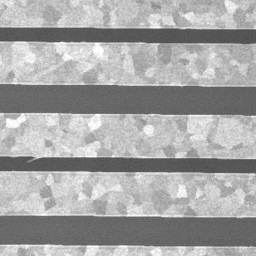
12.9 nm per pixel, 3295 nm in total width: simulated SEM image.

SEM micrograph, lines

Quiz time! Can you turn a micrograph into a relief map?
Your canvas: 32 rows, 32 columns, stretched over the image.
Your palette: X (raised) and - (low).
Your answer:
XXXXXXXXXXXXXXXXXXXXXXXXXXXXXXXX
XXXXXXXXXXXXXXXXXXXXXXXXXXXXXXXX
XXXXXXXXXXXXXXXXXXXXXXXXXXXXXXXX
------------------------XXXXXXXX
--------------------------------
XXXXXXXXXXXXXXXXXX--------------
XXXXXXXXXXXXXXXXXXXXXXXXXXXXXXXX
XXXXXXXXXXXXXXXXXXXXXXXXXXXXXXXX
XXXXXXXXXXXXXXXXXXXXXXXXXXXXXXXX
XXXXXXXXXXXXXXXXXXXXXXXXXXXXXXXX
---XXXXXXXXXXXXXXXXXXXXXXXXXXXXX
--------------------------------
--------------------------------
--------------------------------
XXXXXXXXXXXXXXXXXXXXXXXXXXXXXX--
XXXXXXXXXXXXXXXXXXXXXXXXXXXXXXXX
XXXXXXXXXXXXXXXXXXXXXXXXXXXXXXXX
XXXXXXXXXXXXXXXXXXXXXXXXXXXXXXXX
XXXXXXXXXXXXXXXXXXXXXXXXXXXXXXXX
----XXXXXXXXXXXXXXXXXXXXXXXXXXXX
--------------------------------
--------------------------------
XXXXXXXXXXXXXXXXXXXXXXXXXXXXXXXX
XXXXXXXXXXXXXXXXXXXXXXXXXXXXXXXX
XXXXXXXXXXXXXXXXXXXXXXXXXXXXXXXX
XXXXXXXXXXXXXXXXXXXXXXXXXXXXXXXX
XXXXXXXXXXXXXXXXXXXXXXXXXXXXXXXX
--------------------------------
--------------------------------
--------------------------------
--------------------------------
XXXXXXXXXXXXXXXXXXXXXXXXXXXXXXXX